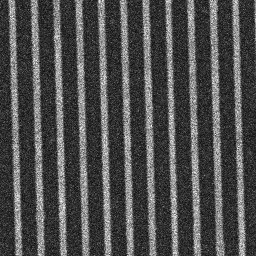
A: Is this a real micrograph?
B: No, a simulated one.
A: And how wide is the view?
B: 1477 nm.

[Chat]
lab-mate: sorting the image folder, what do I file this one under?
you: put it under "parallel lines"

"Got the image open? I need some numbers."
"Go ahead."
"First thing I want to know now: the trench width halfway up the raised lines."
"16.9 px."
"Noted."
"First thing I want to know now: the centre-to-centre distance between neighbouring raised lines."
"129 nm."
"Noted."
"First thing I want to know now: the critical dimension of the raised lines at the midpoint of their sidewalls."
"32.4 nanometres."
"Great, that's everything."